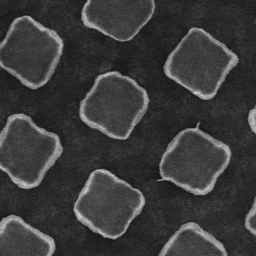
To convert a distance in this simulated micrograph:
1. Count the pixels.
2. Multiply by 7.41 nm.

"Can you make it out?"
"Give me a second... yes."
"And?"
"raised bodies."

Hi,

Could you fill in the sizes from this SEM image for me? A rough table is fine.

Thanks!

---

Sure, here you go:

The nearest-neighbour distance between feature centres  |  708 nanometres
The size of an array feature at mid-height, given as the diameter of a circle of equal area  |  463 nanometres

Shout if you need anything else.